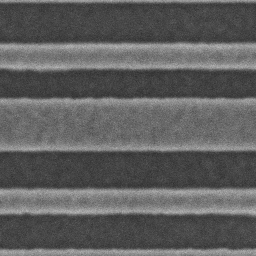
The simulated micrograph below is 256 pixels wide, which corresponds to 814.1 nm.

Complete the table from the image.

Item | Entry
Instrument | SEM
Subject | lines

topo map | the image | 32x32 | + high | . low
................................
................................
................................
................................
................................
................................
++++++++++++++++++++++++++++++++
++++++++++++++++++++++++++++++++
.+++++++++++++++++++++++++++++++
................................
................................
................................
++++++++++++++++++++++++++++++++
++++++++++++++++++++++++++++++++
++++++++++++++++++++++++++++++++
++++++++++++++++++++++++++++++++
++++++++++++++++++++++++++++++++
++++++++++++++++++++++++++++++++
++++++++++++++++++++++++++++++++
................................
................................
................................
................................
................................
++++++++++++++++++++++++++++++++
++++++++++++++++++++++++++++++++
+++.++++++++++++++++++++++++++++
................................
................................
................................
................................
++++++++++++++++++++++++++++++++